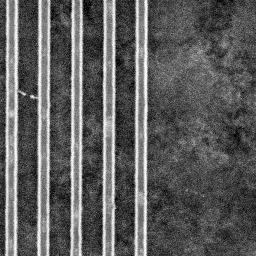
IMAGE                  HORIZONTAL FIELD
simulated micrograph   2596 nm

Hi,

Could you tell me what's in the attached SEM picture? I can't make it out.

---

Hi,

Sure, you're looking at parallel lines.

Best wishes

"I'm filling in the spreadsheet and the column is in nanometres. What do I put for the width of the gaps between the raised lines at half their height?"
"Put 242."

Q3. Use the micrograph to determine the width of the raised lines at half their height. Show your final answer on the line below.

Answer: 90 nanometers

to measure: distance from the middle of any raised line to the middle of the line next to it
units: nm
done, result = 329